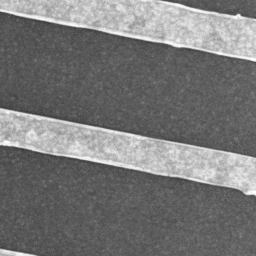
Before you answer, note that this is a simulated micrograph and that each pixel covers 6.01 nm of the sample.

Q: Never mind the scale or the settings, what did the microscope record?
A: one or a few lines or trenches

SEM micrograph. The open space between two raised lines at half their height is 578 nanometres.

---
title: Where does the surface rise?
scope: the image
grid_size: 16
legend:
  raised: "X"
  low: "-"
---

XXXXXXXXXXXX----
----XXXXXXXXXXXX
---------XXXXXXX
--------------XX
----------------
----------------
----------------
XXXX------------
XXXXXXXXX-------
---XXXXXXXXXXX--
--------XXXXXXXX
-------------XXX
----------------
----------------
----------------
----------------